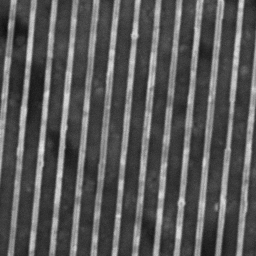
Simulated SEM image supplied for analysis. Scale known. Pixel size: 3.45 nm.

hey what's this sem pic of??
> parallel lines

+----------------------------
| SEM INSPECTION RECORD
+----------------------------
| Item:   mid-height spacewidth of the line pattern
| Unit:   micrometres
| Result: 0.0541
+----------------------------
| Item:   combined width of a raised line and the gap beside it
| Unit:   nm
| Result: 71.2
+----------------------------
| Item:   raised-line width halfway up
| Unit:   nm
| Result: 15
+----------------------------